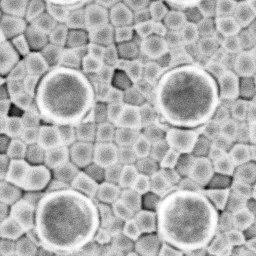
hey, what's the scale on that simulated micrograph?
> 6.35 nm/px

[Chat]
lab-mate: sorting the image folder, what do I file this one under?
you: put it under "raised bodies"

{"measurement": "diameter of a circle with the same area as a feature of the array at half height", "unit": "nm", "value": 358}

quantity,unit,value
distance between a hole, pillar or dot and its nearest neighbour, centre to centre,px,122